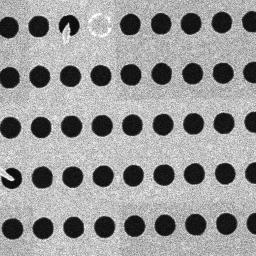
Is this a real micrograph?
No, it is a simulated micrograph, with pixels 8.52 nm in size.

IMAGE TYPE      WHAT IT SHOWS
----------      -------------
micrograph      a regular array of holes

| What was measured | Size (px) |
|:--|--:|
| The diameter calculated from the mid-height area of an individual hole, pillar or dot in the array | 20.9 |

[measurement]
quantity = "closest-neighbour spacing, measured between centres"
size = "258 nm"